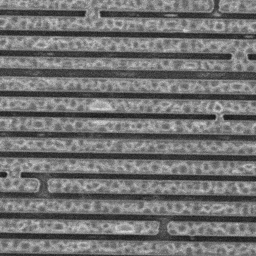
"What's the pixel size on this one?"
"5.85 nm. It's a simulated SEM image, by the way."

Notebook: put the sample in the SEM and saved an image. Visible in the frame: parallel lines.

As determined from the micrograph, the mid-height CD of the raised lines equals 0.0819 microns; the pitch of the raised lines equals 119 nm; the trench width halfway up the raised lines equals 40.9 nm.